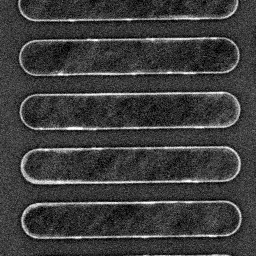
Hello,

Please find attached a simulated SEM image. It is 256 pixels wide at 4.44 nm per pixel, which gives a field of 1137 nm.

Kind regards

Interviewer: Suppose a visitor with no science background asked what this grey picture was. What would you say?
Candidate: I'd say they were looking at groups of lines, slits or small figures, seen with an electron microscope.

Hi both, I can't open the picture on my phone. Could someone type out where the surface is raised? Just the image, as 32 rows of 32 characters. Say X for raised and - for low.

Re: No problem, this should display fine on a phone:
--XXXXXXXXXXXXXXXXXXXXXXXXXXXX--
---XXXXXXXXXXXXXXXXXXXXXXXXXX---
----XXXXXXXX--------------------
--------------------------------
--------------------------------
---XXXXXXXXXXXXXXXXXXXXXXXXXX---
---XXXXXXXXXXXXXXXXXXXXXXXXXXX--
---XXXXXXXXXXXXXXXXXXXXXXXXXXX--
---XXXXXXXXXXXXXXXXXXXXXXXXXX---
--------------------------------
--------------------------------
--------------------------------
---XXXXXXXXXXXXXXXXXXXXXXXXXXX--
---XXXXXXXXXXXXXXXXXXXXXXXXXXX--
---XXXXXXXXXXXXXXXXXXXXXXXXXXX--
---XXXXXXXXXXXXXXXXXXXXXXXXXX---
--------------------------------
--------------------------------
------------------XXXXXXXXXXX---
---XXXX-XXXXXXXXXXXXXXXXXXXXXX--
---------XXXXXXXXXXXXXXXXXXXXX--
----------XXXXXXXXXXXXXXXXXXXX--
----------XXXXXXXXXXXXXXXXXXX---
--------------------------------
--------------------------------
-------XXXXXXXXXXXXXXXXXXXXXX---
---XXXXXXXXXXXXXXXXXXXXXXXXXXX--
---XXXXXXXXXXXXXXXXXXXXXXXXXXX--
---XXXXXXXXXXXXXXXXXXXXXXXXXXX--
----XXXXXXXXXXXXXXXXX-----------
--------------------------------
--------------------------------